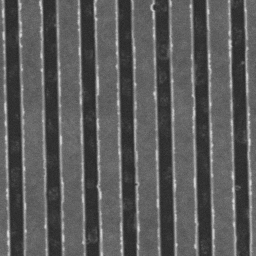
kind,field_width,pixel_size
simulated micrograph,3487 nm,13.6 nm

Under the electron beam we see parallel lines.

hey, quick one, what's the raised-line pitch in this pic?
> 37.6 pixels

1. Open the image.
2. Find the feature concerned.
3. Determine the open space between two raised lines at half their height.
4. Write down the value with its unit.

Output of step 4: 199 nm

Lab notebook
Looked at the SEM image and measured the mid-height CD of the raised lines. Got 310 nm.